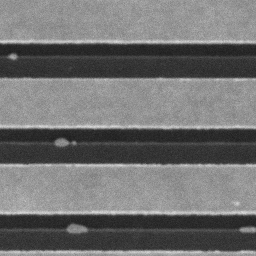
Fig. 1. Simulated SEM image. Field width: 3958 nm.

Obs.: lines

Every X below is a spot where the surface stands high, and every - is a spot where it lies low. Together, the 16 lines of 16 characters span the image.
XXXXXXXXXXXXXXXX
XXXXXXXXXXXXXXXX
XXXXXXXXXXXXXXXX
----------------
----------------
XXXXXXXXXXXXXXXX
XXXXXXXXXXXXXXXX
XXXXXXXXXXXXXXXX
----------------
----------------
XXXXXXXXXXXXXXXX
XXXXXXXXXXXXXXXX
XXXXXXXXXXXXXXXX
----------------
----------------
----------------